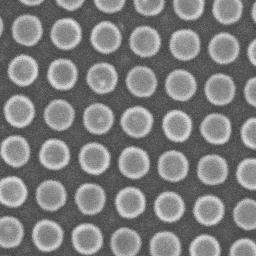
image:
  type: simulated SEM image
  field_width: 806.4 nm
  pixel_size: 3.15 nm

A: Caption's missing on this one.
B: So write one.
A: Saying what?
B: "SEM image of a regular array of raised bodies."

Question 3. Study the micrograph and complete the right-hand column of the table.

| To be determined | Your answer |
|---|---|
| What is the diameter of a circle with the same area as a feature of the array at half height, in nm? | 89.8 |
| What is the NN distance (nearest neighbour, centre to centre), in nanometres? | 124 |